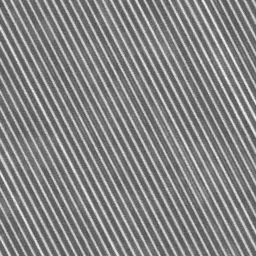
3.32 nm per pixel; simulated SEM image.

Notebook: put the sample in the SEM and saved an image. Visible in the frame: parallel lines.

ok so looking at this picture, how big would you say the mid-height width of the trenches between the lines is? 0.0181 µm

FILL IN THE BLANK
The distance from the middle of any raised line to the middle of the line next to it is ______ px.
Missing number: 7.41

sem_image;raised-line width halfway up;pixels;1.78